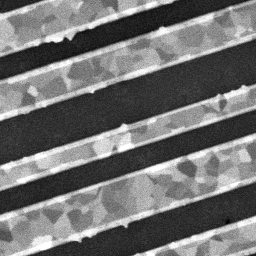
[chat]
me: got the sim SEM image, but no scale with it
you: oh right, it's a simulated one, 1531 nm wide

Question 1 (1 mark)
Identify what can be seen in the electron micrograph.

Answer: one or a few lines or trenches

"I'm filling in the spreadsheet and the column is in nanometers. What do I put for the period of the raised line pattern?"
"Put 397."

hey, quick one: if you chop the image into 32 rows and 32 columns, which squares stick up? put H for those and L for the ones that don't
LLLLLHHHHHHHHHHHHHHHLLLLLLLLLLLH
LLHHHHHHHHHHHHHHHLLLLLLLLLLLHHHH
HHHHHHHHHHHHHHLLLLLLLLLLHHHHHHHH
HHHHHHHHHHHHLLLLLLLLHHHHHHHHHHHH
HHHHHHHHHLLLLLLLLLHHHHHHHHHHHHHH
HHHHHLLLLLLLLLLHHHHHHHHHHHHHHLLL
HLLLLLLLLLLLHHHHHHHHHHHHHHLLLLLL
LLLLLLLLLHHHHHHHHHHHHHHLLLLLLLLL
LLLLLLHHHHHHHHHHHHHHLLLLLLLLLLLL
LLLHHHHHHHHHHHHHHLLLLLLLLLLLLLLL
HHHHHHHHHHHHHHLLLLLLLLLLLLLLLLLL
HHHHHHHHHHHHLLLLLLLLLLLLLLLLLHHH
HHHHHHHLLLLLLLLLLLLLLLLLLLHHHHHH
HHHHLLLLLLLLLLLLLLLLLLLLHHHHHHHH
HLLLLLLLLLLLLLLLLLLLHHHHHHHHLLLL
LLLLLLLLLLLLLLLLLHHHHHHHHLLLLLLL
LLLLLLLLLLLLLLHHHHHHHHLLLLLLLLLL
LLLLLLLLLLLHHHHHHHHLLLLLLLLLLLHH
LLLLLLLHHHHHHHHHLLLLLLLLLLLHHHHH
LLLLHHHHHHHHHLLLLLLLLLLLHHHHHHHH
LHHHHHHHHHLLLLLLLLLLLHHHHHHHHHHH
HHHHHHHLLLLLLLLLLLHHHHHHHHHHHHHH
HHHHLLLLLLLLLLLHHHHHHHHHHHHHHHHH
LLLLLLLLLLLHHHHHHHHHHHHHHHHHHLLL
LLLLLLLLHHHHHHHHHHHHHHHHHLLLLLLL
LLLLLHHHHHHHHHHHHHHHHHHLLLLLLLLL
LLHHHHHHHHHHHHHHHHHLLLLLLLLLLLLL
HHHHHHHHHHHHHHHHHLLLLLLLLLLLLLLH
HHHHHHHHHHHHHLLLLLLLLLLLLLLLHHHH
HHHHHHHHHHHHLLLLLLLLLLLLHHHHHHHH
HHHHHHHLLLLLLLLLLLLLLHHHHHHHHHHH
HHHHLLLLLLLLLLLLLLLHHHHHHHHHHHHH